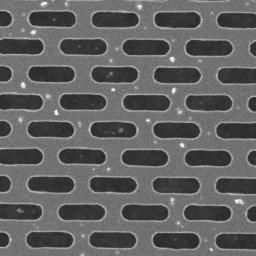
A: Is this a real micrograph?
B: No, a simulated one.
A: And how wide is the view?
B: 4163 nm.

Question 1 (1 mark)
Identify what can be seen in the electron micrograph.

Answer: a regular array of holes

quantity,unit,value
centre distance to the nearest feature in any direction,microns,0.675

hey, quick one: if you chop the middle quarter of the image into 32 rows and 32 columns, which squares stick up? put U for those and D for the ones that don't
UUUUUUUUUUUUUUUUUUUUUUUUUUUUUUUU
DDUUUUUDDDDDDDDDDDUUUUUDDDDDDDDD
DDDUUUUDDDDDDDDDDDDUUUDDDDDDDDDD
DDUUUUUDDDDDDDDDDDUUUUUDDDDDDDDD
DUUUUUUUDDDDDDDDDUUUUUUUDDDDDDDD
UUUUUUUUUUUUUUUUUUUUUUUUUUUUUUUU
UUUUUUUUUUUUUUUUUUUUUUUUUUUUUUUU
DDDDDDDDDUUUUUUUUUUUUUUUUUUUUUUU
DDDDDDDDDDUUUUUDDDDDDDDDDDUUUUUD
DDDDDDDDDDDUUUUDDDDDDDDDDDDUUUDD
DDDDDDDDDDUUUUUDDDDDDDDDDDUUUUUD
UDDDDDDDDUUUUUUUUDDDDDDDDDUUUUUU
UUUUUUUUUUUUUUUUUUUUUUUUUUUUUUUU
UUUUUUUUUUUUUUUUUUUUUUUUUUUUUUUU
DUUUUUUUDDDDDDDUUUUUUUUUDUUUUUUU
DDUUUUUDDDDDDDDDDDUUUUDDDDDDDDDD
DDDUUUDDDDDDDDDDDDUUUUDDDDDDDDDD
DDDUUUUDDDDDDDDDDDUUUUDDDDDDDDDD
UUUUUUUUUDDDDDDDDUUUUUUUDDDUUDDD
UUUUUUUUUUUUUUUUUUUUUUUUUUUUUUUU
UUUUUUUUUUUUUUUUUUUUUUUUUUUUUUUU
DDDDDDDDDUUUUUUUDDDDDDDDUUUUUUUU
DDDDDDDDDDUUUUUDDDDDDDDDDDUUUUUD
DDDDDDDDDDDUUUDDDDDDDDDDDDUUUUDD
DDDDDDDDDDUUUUUDDDDDDDDDDDUUUUDD
UUUUUUUUUUUUUUUUDDDDDDDDDUUUUUUU
UUUUUUUUUUUUUUUUUUUUUUUUUUUUUUUU
UUUUUUUUUUUUUUUUUUUUUUUUUUUUUUUU
DDUUUUUDDDDDDDDDDUUUUUUUDDDDDDDD
DDUUUUDDDDDDDDDDDDUUUUDDDDDDDDDD
DDDUUUDDDDDDDDDDDDUUUUDDDDDDDDDD
DDUUUUUDDDDDDDDDDDUUUUUDDDDDDDDD